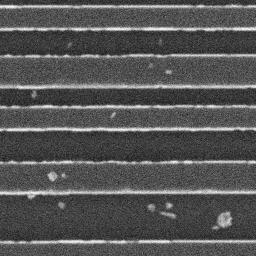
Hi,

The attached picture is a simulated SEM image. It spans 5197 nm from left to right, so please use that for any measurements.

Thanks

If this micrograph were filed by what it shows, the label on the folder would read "lines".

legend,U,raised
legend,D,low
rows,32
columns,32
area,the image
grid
DDDDDDDDDDDDDDDDDDDDDDDDDDDDDDDD
UUUUUUUUUUUUUUUUUUUUUUUUUUUUUUUU
UUUUUUUUUUUUUUUUUUUUUUUUUUUUUUUU
UUUUUUUUUUUUUUUUUUUUUUUUUUUUUUUU
DDDDDDDDDDDDDDDDDDDDDDDDDDDDDDDD
DDDDDDDDDDDDDDDDDDDDDDDDDDDDDDDD
DDDDDDDDDDDDDDDDDDDDDDDDDDDDDDDD
UUUUUUUUUUUUUUUUUUUUUUUUUUUUUUUU
UUUUUUUUUUUUUUUUUUUUUUUUUUUUUUUU
UUUUUUUUUUUUUUUUUUUUUUUUUUUUUUUU
UUUUUUUUUUUUUUUUUUUUUUUUUUUUUUUU
DDDDDDDDDDDDDDDDDDDDDDDDDDDDDDDD
DDDDDDDDDDDDDDDDDDDDDDDDDDDDDDDD
UUUUUUUUUUUUUUUUUUUUUUUUUUUUUUUU
UUUUUUUUUUUUUUUUUUUUUUUUUUUUUUUU
UUUUUUUUUUUUUUUUUUUUUUUUUUUUUUUU
DDDDDDDDDDDDDDDDDDDDDDDDDDDDDDDD
DDDDDDDDDDDDDDDDDDDDDDDDDDDDDDDD
DDDDDDDDDDDDDDDDDDDDDDDDDDDDDDDD
DDDDDDDDDDDDDDDDDDDDDDDDDDDDDDDD
UUUUUUUUUUUUUUUUUUUUUUUUUUUUUUUU
UUUUUUUUUUUUUUUUUUUUUUUUUUUUUUUU
UUUUUUUUUUUUUUUUUUUUUUUUUUUUUUUU
UUUUUUUUUUUUUUUUUUUUUUUUUUUUUUUU
DDDDDDDDDDDDDDDDDDDDDDDDDDDDDDDD
DDDDDDDDDDDDDDDDDDDDDDDDDDDDDDDD
DDDDDDDDDDDDDDDDDDDDDDDDDDDDDDDD
DDDDDDDDDDDDDDDDDDDDDDDDDDDDDDDD
DDDDDDDDDDDDDDDDDDDDDDDDDDDDDDDD
DDDDDDDDDDDDDDDDDDDDDDDDDDDDDDDD
UUUUUUUUUUUUUUUUUUUUUUUUUUUUUUUU
UUUUUUUUUUUUUUUUUUUUUUUUUUUUUUUU